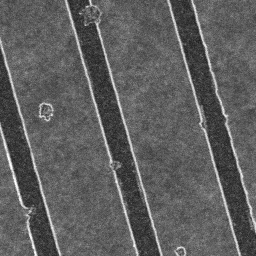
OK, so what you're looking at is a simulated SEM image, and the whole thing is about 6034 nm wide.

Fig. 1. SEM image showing one or a few lines or trenches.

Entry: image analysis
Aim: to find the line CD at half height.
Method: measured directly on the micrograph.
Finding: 528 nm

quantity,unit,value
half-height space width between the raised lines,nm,1790